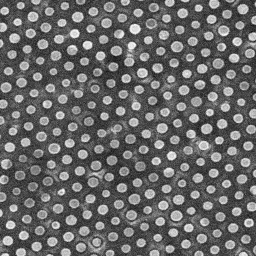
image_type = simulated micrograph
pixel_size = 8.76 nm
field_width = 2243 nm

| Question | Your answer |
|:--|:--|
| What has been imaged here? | a regular array of raised bodies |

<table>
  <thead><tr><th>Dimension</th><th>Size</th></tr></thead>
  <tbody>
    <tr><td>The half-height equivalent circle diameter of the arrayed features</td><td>73.3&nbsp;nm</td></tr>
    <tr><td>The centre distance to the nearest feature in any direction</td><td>143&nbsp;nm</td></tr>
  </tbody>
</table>